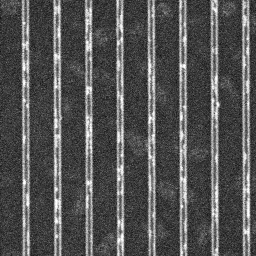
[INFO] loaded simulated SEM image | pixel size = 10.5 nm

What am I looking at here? parallel lines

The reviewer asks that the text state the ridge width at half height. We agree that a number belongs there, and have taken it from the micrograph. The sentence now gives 58 nm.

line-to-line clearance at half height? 277 nanometers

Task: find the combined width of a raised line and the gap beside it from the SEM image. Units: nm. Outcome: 332